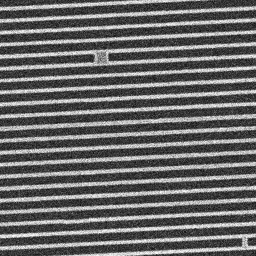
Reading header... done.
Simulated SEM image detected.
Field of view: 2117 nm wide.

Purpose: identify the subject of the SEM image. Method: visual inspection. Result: parallel lines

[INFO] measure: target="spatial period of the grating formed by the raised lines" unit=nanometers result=98.9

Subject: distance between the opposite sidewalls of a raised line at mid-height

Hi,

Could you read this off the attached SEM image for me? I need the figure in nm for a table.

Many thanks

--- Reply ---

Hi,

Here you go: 23.7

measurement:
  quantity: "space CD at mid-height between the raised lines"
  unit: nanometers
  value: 75.4